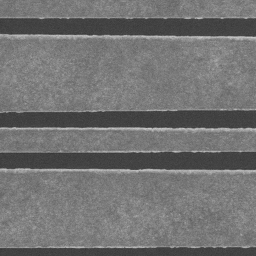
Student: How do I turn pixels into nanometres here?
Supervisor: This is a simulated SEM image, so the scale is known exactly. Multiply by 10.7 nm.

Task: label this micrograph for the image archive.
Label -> lines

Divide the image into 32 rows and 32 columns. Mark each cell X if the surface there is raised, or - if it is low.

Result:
XXXXXXXXXXXXXXXXXXXXXXXXXXXXXXXX
XXXXXXXXXXXXXXXXXXXXXXXXXXXXXXXX
--------------------------------
--------------------------------
XXXX-X--------------------------
XXXXXXXXXXXXXXXXXXXXXXXXXXXXXXXX
XXXXXXXXXXXXXXXXXXXXXXXXXXXXXXXX
XXXXXXXXXXXXXXXXXXXXXXXXXXXXXXXX
XXXXXXXXXXXXXXXXXXXXXXXXXXXXXXXX
XXXXXXXXXXXXXXXXXXXXXXXXXXXXXXXX
XXXXXXXXXXXXXXXXXXXXXXXXXXXXXXXX
XXXXXXXXXXXXXXXXXXXXXXXXXXXXXXXX
XXXXXXXXXXXXXXXXXXXXXXXXXXXXXXXX
XXXXXXXXXXXXXXXXXXXXXXXXXXXXXXXX
--------------------------------
--------------------------------
XXXXXXXXXXXXXXXXXXXXXXXXXXXXXXXX
XXXXXXXXXXXXXXXXXXXXXXXXXXXXXXXX
XXXXXXXXXXXXXXXXXXXXXXXXXXXXXXXX
--------------------------------
--------------------------------
XXXXXXXXXXXXXXXXXXXXXXXXXXXXXXXX
XXXXXXXXXXXXXXXXXXXXXXXXXXXXXXXX
XXXXXXXXXXXXXXXXXXXXXXXXXXXXXXXX
XXXXXXXXXXXXXXXXXXXXXXXXXXXXXXXX
XXXXXXXXXXXXXXXXXXXXXXXXXXXXXXXX
XXXXXXXXXXXXXXXXXXXXXXXXXXXXXXXX
XXXXXXXXXXXXXXXXXXXXXXXXXXXXXXXX
XXXXXXXXXXXXXXXXXXXXXXXXXXXXXXXX
XXXXXXXXXXXXXXXXXXXXXXXXXXXXXXXX
XXXXXXXXXXXXXXXXXXXXXXXXXXXXXXXX
--------------------------------